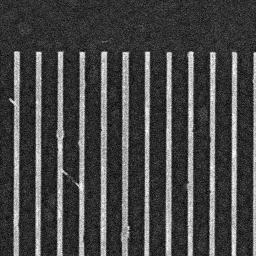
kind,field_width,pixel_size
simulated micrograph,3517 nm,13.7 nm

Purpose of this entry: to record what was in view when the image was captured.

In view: parallel lines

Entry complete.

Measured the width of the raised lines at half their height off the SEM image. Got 53.2 nanometres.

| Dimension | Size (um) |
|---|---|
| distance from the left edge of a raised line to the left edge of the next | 0.299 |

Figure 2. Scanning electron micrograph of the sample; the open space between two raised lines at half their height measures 0.247 um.